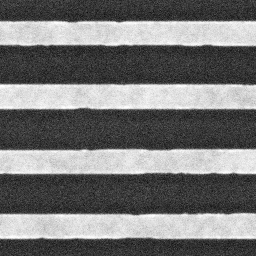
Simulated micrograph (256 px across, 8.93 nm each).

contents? lines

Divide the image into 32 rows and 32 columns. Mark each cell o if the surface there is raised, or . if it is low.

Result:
................................
................................
................................
oooooooooooooooooooooooooooooooo
oooooooooooooooooooooooooooooooo
oooooooooooooooooooooooooooooooo
................................
................................
................................
................................
................................
oooooooooooooooooooooooooooooooo
oooooooooooooooooooooooooooooooo
oooooooooo.ooooooooooooooooooooo
................................
................................
................................
................................
................................
oooooooooooooooooooooooooooooooo
oooooooooooooooooooooooooooooooo
oooooooooooooooooooooooooooooooo
................................
................................
................................
................................
................................
oooooooooooooooooooooooooooooooo
oooooooooooooooooooooooooooooooo
oooooooooooooooooooooooooooooooo
................................
................................